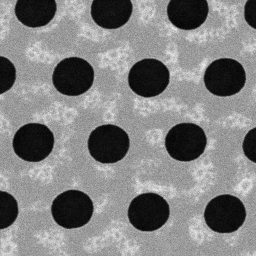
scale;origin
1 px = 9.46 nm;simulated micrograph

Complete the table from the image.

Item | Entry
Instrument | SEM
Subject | a regular array of holes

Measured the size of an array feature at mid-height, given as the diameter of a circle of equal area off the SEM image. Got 386 nm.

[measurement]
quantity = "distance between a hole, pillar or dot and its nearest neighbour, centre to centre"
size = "0.709 micrometres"